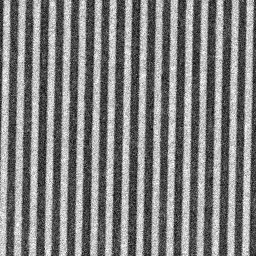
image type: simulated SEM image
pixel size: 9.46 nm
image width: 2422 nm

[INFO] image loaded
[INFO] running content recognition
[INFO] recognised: parallel lines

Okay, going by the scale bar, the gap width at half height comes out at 81.6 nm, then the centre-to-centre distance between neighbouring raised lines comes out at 144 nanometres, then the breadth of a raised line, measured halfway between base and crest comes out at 57.9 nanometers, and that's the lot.